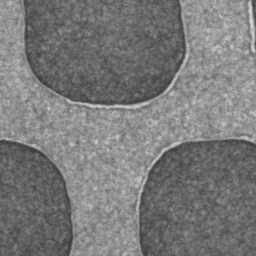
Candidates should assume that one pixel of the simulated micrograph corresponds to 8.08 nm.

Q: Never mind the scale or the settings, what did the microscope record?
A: holes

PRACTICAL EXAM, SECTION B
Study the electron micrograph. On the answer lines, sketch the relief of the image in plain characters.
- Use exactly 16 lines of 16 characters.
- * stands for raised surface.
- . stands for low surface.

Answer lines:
*..........*****
**.........*****
**..........****
**..........****
**.........*****
***.......******
******...*******
****************
****************
...*******......
....*****.......
....*****.......
....*****.......
....*****.......
.....****.......
.....****.......